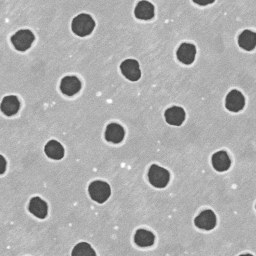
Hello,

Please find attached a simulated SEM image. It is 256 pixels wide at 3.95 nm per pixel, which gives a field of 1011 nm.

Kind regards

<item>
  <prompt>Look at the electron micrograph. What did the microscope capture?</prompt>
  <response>a regular array of holes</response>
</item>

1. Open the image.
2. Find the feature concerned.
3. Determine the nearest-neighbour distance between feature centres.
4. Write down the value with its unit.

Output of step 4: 242 nanometres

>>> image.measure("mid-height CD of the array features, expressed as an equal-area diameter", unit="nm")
88.6